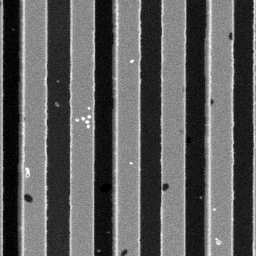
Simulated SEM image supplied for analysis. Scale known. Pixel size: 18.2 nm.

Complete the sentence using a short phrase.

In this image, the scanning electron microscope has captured lines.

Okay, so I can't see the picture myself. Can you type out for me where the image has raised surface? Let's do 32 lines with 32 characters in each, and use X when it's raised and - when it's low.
---XXX---XXX--XXX---XXX---XXX---
---XXX---XXX--XXX---XXX---XXX---
---XXX---XXX--XXX---XXX---XXX---
---XXX---XXX--XXX---XXX---XXX---
---XXX---XXX--XXX---XXX---XXX---
---XXX---XXX--XXX---XXX---XXX---
---XXX---XXX--XXX---XXX---XXX---
---XXX---XXX--XXX---XXX---XXX---
---XXX---XXX--XXX---XXX---XXX---
---XXX---XXX--XXX---XXX---XXX---
---XXX---XXX--XXX---XXX---XXX---
---XXX---XXX--XXX---XXX---XXX---
---XXX---XXX--XXX---XXX---XXX---
---XXX---XXX--XXX---XXX---XXX---
---XXX---XXX--XXX---XXX---XXX---
---XXX---XXX--XXX---XXX---XXX---
---XXX---XXX--XXX---XXX---XXX---
---XXX---XXX--XXX---XXX---XXX---
---XXX---XXX--XXX---XXX---XXX---
---XXX---XXX--XXX---XXX---XXX---
---XXX---XXX--XXX---XXX---XXX---
---XXX---XXX--XXX---XXX---XXX---
---XXX---XXX--XXX---XXX---XXX---
---XXX---XXX--XXX---XXX---XXX---
---XXX---XXX--XXX---XXX---XXX---
---XXX---XXX--XXX---XXX---XXX---
---XXX---XXX--XXX---XXX---XXX---
---XXX---XXX--XXX---XXX---XXX---
---XXX---XXX--XXX---XXX---XXX---
---XXX---XXX--XXX---XXX---XXX---
---XXX---XXX--XXX---XXX---XXX---
---XXX---XXX--XXX---XXX---XXX---